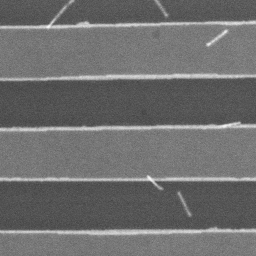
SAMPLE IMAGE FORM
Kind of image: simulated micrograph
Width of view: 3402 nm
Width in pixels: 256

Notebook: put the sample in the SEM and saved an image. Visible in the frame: lines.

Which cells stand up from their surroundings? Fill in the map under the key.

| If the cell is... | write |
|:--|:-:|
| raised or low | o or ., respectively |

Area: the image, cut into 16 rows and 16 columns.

................
.........ooooooo
oooooooooooooooo
oooooooooooooooo
oooooooooooooooo
................
................
................
oooooooooooooooo
oooooooooooooooo
oooooooooooooooo
................
................
................
oooooo.ooooooooo
oooooooooooooooo